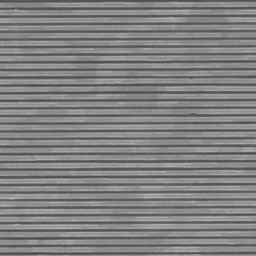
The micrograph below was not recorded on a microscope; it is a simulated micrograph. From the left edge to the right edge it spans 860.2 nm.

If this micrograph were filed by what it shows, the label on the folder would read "parallel lines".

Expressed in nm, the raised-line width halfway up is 14.3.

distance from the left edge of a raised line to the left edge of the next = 0.0257 micrometres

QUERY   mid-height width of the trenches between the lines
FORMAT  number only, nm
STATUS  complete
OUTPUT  11.3